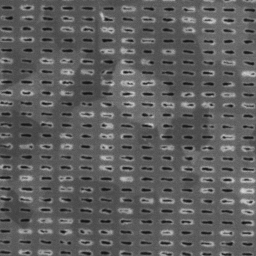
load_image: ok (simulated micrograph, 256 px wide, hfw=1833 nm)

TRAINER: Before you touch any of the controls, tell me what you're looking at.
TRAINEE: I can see a regular array of holes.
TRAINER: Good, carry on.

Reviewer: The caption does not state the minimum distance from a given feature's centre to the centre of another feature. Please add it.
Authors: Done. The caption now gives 10.5 px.